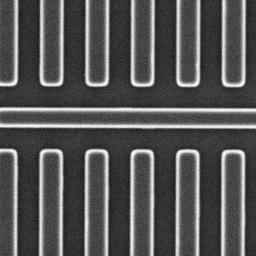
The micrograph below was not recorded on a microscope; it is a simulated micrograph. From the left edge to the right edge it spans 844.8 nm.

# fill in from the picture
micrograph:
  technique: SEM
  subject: groups of lines, slits or small figures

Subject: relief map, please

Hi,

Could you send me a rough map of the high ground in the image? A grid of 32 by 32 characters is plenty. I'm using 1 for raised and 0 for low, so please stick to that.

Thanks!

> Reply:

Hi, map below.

11000111000110000110001110001110
11000111000110000110001110001110
11000111000110000110001110001110
11000111000110000110001110001110
11000111000110000110001110001110
11000111000110000110001110001110
11000111000110000110001110001110
11000111000110000110001110001110
11000111000110000110001110001110
11000111000110000110001110001110
11000010000110000110000100001100
00000000000000000000000000000000
00000000000000000000000000000000
00000000000000000000000000000000
11111111111111111111111111111111
11111111111111111111111111111111
00000000000000000000000000000000
00000000000000000000000000000000
00000000000000000000000000000000
11000111000110000110001110001100
11000111000110001110001110001100
11000111000110001110001110001100
11000111000110001110001110001100
11000111000110001110001110001100
11000111000110001110001110001100
11000111000110001110001110001100
11000111000110001110001110001100
11000111000110001110001110001100
11000111000110001110001110001100
11000111000110001110001110001100
11000111000110001110001110001100
11000111000110001110001110001100